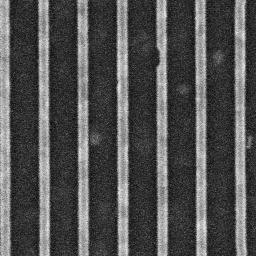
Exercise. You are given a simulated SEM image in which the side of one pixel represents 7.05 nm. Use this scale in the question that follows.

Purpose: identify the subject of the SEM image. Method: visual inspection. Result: parallel lines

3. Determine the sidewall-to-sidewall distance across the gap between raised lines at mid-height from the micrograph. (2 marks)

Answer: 212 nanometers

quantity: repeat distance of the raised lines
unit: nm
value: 277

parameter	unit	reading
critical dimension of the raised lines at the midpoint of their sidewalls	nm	61.7